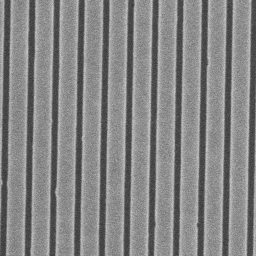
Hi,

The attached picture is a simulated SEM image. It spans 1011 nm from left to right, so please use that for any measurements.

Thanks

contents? parallel lines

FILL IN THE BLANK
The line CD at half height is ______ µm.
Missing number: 0.071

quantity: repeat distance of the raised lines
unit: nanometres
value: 97.3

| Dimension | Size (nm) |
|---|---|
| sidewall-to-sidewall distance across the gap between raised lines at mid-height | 27.1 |